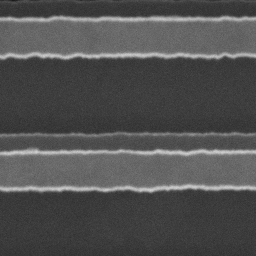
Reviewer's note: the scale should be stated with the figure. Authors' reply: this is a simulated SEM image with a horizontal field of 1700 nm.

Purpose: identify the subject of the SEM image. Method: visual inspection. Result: lines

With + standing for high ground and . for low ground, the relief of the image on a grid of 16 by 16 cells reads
++++++++++++++++
++++++++++++++++
++++++++++++++++
+++++++++.++++++
................
................
................
................
++++++++++++++++
++++++++++++++++
++++++++++++++++
++++++++++++++++
................
................
................
................